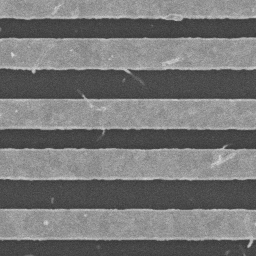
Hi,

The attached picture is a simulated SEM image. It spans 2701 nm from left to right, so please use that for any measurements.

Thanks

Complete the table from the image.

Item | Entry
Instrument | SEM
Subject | lines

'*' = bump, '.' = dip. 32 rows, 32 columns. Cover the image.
********************************
********************************
.....................**.........
................................
................................
********************************
********************************
********************************
.*******************************
................................
................................
................................
********************************
********************************
********************************
********************************
................................
................................
................................
********************************
********************************
********************************
................................
................................
................................
................................
********************************
********************************
********************************
********************************
................................
................................